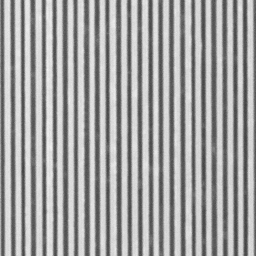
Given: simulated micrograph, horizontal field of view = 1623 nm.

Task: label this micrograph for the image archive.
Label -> parallel lines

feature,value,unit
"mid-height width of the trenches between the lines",33.3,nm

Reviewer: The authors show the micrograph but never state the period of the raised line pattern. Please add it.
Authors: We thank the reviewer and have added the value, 10.6 px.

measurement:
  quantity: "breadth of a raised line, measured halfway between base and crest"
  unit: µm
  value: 0.0341